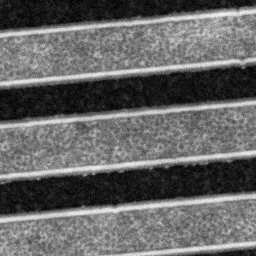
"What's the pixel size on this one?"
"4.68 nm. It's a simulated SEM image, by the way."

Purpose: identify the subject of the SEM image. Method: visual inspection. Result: one or a few lines or trenches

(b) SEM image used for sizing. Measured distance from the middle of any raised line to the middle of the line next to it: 0.429 microns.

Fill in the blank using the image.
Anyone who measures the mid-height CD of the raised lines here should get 0.226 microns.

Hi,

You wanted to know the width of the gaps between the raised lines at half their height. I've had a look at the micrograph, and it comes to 199 nm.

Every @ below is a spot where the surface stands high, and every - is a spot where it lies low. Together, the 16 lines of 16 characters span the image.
----------------
--------@@@@@@@@
@@@@@@@@@@@@@@@@
@@@@@@@@@@@@@@@@
@@@@@@@@--------
----------------
---------------@
----@@@@@@@@@@@@
@@@@@@@@@@@@@@@@
@@@@@@@@@@@@@@@@
@@@@@@----------
----------------
--------------@@
---@@@@@@@@@@@@@
@@@@@@@@@@@@@@@@
@@@@@@@@@@@@@---